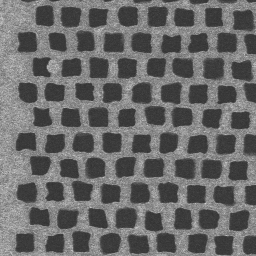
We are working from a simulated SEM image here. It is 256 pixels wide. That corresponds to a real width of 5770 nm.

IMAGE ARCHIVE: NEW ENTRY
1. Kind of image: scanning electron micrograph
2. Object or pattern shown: a regular array of holes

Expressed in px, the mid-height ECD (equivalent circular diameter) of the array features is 20.5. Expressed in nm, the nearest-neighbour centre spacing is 610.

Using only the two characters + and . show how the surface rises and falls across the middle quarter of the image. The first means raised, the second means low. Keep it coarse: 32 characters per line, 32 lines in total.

....+++....++.....+++....++.....
....++.....+++....+++....++.....
....++.....+++....+++....+++....
+++++++...++++..++++++++++++++++
++++++++++++++++++++++++++++++++
+++....+++....+++....++++....+++
+++....+++.....++.....++.....++.
+++....+++.....++.....++.....++.
+++.....++.....++.....++.....++.
++++++++++.++++++.....+++++..++.
+++++++++++++++++++++.++++++++++
...+++.....+++....++.....++.....
....++.....+++....++.....++.....
....++.....++.....++.....++.....
....++.....+++....+++....++.....
....+++....+++...++++++++++....+
++++++++++++++++++++++++++++++++
+++..+++++....+++++++++++.++++++
+++....+++....+++.....++....+++.
++.....+++....+++.....++....+++.
++.....+++....+++....+++....+++.
++.....+++....+++.....++....+++.
+++++++++++++++++++++++++++++++.
++++++...+++++....++++++++++++++
...+++....+++.....++.....+++....
....++....+++.....++.....+++....
....++....+++.....++.....+++....
....++....+++....+++.....+++....
+...+++.++++++++++++++++++++++..
++...+++++++++++++++++++++++++++
++.....+++...++++....+++....+++.
++.....++.....+++....+++.....++.